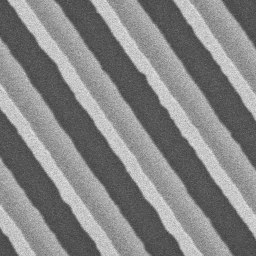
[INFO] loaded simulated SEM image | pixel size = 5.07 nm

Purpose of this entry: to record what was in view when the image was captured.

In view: lines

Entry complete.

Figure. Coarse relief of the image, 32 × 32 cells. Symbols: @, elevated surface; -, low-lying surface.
-@@@@@@-----@@@@@-----@@@@@@----
--@@@@@@----@@@@@@-----@@@@@@---
---@@@@@-----@@@@@@----@@@@@@---
---@@@@@@-----@@@@@@----@@@@@@--
----@@@@@@----@@@@@@-----@@@@@@-
-----@@@@@@----@@@@@@----@@@@@@-
@-----@@@@@-----@@@@@@----@@@@@@
@@-----@@@@@----@@@@@@-----@@@@@
@@@----@@@@@@----@@@@@@-----@@@@
@@@-----@@@@@-----@@@@@@----@@@@
@@@@----@@@@@@-----@@@@@-----@@@
@@@@@----@@@@@@----@@@@@@-----@@
@@@@@-----@@@@@-----@@@@@@----@@
@@@@@@----@@@@@@-----@@@@@-----@
-@@@@@@----@@@@@@----@@@@@@-----
--@@@@@-----@@@@@-----@@@@@@----
--@@@@@@-----@@@@@-----@@@@@@---
---@@@@@@----@@@@@@----@@@@@@---
----@@@@@-----@@@@@@----@@@@@@--
----@@@@@@-----@@@@@-----@@@@@@-
-----@@@@@@----@@@@@@----@@@@@@-
@-----@@@@@-----@@@@@@----@@@@@@
@@-----@@@@@-----@@@@@-----@@@@@
@@@----@@@@@@----@@@@@@-----@@@@
@@@-----@@@@@@----@@@@@@----@@@@
@@@@----@@@@@@-----@@@@@-----@@@
@@@@@----@@@@@@-----@@@@@-----@@
@@@@@-----@@@@@@----@@@@@@----@@
@@@@@@----@@@@@@-----@@@@@@----@
-@@@@@@----@@@@@@-----@@@@@-----
-@@@@@@-----@@@@@@----@@@@@@----
--@@@@@@----@@@@@@-----@@@@@@---